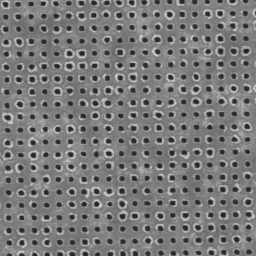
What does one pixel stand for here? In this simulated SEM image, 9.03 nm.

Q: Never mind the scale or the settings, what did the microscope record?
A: a regular array of holes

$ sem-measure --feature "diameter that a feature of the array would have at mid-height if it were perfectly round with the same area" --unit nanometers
48.9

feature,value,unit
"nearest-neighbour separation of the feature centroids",110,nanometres